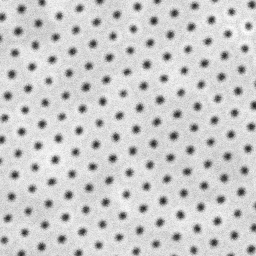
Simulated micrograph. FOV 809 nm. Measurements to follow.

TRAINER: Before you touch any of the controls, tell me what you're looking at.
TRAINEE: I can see a regular array of holes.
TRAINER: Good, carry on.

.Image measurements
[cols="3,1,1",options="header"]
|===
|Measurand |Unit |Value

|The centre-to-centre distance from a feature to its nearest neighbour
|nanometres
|68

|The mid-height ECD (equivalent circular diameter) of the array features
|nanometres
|26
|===